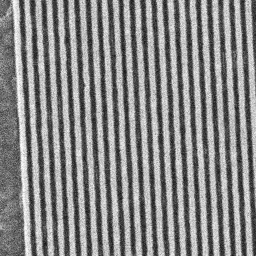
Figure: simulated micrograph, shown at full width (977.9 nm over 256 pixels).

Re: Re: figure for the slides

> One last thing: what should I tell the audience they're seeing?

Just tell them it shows parallel lines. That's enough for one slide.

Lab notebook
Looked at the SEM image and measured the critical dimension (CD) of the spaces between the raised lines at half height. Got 0.0224 microns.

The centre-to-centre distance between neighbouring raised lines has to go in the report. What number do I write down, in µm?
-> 0.0421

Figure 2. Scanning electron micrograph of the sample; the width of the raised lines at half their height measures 18.6 nm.